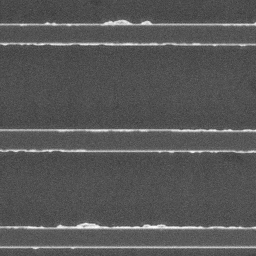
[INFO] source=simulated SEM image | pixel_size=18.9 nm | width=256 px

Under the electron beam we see lines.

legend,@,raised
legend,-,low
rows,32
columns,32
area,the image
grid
--------------------------------
--------------------------------
--------------------------------
@@@@@@@@@@@@@@@@@@@@@@@@@@@@@@@@
@@@@@@@@@@@@@@@@@@@@@@@@@@@@@@@@
@-@-@@@@@-@@@@@@@@@@@@@@@@@@@@@@
--------------------------------
--------------------------------
--------------------------------
--------------------------------
--------------------------------
--------------------------------
--------------------------------
--------------------------------
--------------------------------
--------------------------------
@@@@@@@@@@@@@@@@@@@@@@@@@@@@@@@@
@@@@@@@@@@@@@@@@@@@@@@@@@@@@@@@@
@@@@@@@@@@@@@@@@@@@@@@@@@@@@@@@@
--------------------------------
--------------------------------
--------------------------------
--------------------------------
--------------------------------
--------------------------------
--------------------------------
--------------------------------
--------------------------------
@@@@@@-@@@@@@@@@@@@@@@@@@@@@@@@@
@@@@@@@@@@@@@@@@@@@@@@@@@@@@@@@@
@@@@@@@@@@@@@@@@@@@@@@@@@@@@@@@@
--------------------------------